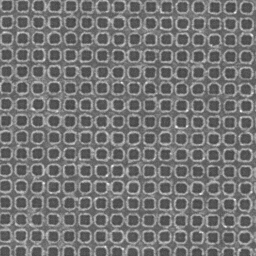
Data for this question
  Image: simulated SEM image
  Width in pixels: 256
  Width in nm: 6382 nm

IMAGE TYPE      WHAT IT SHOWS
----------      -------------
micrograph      a regular array of holes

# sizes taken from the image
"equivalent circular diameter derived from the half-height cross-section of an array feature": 298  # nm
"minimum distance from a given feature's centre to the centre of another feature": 392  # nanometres